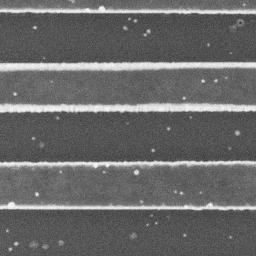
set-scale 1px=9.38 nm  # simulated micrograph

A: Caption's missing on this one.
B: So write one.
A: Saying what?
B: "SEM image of lines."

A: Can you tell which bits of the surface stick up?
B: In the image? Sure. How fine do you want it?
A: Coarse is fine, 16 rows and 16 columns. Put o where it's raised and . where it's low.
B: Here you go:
oooooooooooooooo
................
................
................
oooooooooooooooo
oooooooooooooooo
oooooooooooooooo
................
................
................
oooooooooooooooo
oooooooooooooooo
oooooooooooooooo
................
................
................